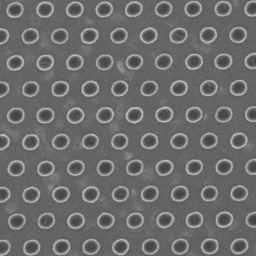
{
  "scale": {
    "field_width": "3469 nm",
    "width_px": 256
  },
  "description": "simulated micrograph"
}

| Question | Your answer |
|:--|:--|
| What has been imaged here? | a regular array of raised bodies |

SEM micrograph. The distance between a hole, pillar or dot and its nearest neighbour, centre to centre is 401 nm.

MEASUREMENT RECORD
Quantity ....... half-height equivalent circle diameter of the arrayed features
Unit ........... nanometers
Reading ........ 214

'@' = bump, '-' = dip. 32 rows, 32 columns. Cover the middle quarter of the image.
-@@@----@@@@----@@@----@@@-----@
--------------------------------
--------------------------------
--------------------------------
------@------@@-----@@@-----@@--
@----@@@----@@@@----@@@----@@@@-
@----@@@----@@@@---@@@@----@@@@-
-----@@@----@@@-----@@-----@@@--
--------------------------------
--------------------------------
--------------------------------
--@@-----@@@----@@@-----@@@----@
-@@@@---@@@@----@@@@---@@@@----@
-@@@@---@@@@----@@@----@@@@----@
--@@-----@-------@--------------
--------------------------------
--------------------------------
---------------------@------@@--
@----@@@----@@@@----@@@----@@@@-
@----@@@@---@@@@---@@@@----@@@@-
@----@@@----@@@-----@@@----@@@--
--------------------------------
--------------------------------
--------------------------------
--@@-----@@@-----@@-----@@-----@
-@@@@---@@@@----@@@@---@@@@----@
-@@@@---@@@@----@@@@---@@@@----@
--@@-----@@------@@-----@@-----@
--------------------------------
--------------------------------
--------------------------------
@----@@@-----@@@----@@@----@@@@-